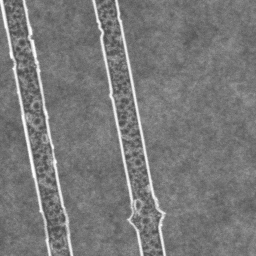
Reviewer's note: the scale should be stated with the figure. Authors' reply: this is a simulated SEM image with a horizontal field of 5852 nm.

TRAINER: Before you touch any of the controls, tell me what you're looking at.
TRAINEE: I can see one or a few lines or trenches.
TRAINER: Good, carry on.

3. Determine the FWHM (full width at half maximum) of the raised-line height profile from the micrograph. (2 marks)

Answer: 505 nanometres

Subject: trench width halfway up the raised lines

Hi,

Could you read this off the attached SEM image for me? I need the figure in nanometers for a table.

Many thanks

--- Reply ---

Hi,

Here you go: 1580